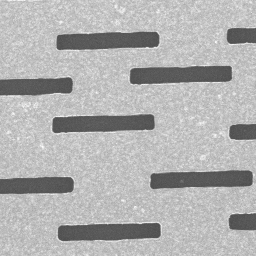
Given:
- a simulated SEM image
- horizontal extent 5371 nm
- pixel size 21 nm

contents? holes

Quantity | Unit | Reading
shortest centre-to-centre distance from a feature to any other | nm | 1740